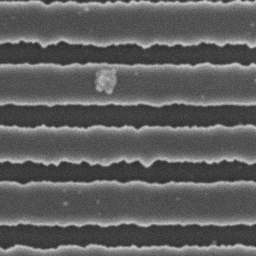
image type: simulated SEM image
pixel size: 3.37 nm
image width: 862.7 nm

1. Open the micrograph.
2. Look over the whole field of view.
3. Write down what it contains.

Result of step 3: lines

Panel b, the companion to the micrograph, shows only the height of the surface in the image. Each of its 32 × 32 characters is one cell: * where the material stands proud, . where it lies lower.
********************************
********************************
********************************
********************************
********************************
.....**...*****..********..*...*
................................
................................
********************************
********************************
********************************
********************************
********************************
................................
................................
................................
********************************
********************************
********************************
********************************
.....*.....***....*.............
................................
................................
********************************
********************************
********************************
********************************
********************************
................................
................................
................................
********************************